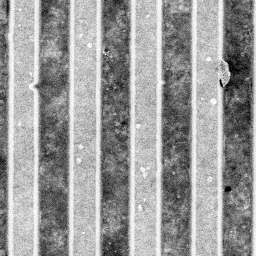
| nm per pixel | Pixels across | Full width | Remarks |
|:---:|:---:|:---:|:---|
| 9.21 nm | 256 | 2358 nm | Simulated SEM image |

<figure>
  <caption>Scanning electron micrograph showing one or a few lines or trenches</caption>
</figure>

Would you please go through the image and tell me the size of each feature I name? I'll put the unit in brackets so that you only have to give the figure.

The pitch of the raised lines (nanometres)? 564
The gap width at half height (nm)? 318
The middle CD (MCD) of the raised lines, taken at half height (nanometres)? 246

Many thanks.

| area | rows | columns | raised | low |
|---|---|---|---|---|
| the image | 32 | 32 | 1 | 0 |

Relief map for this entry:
01111000011100000111000011110000
01111000011100000111000011110000
01111000011100000111000011110000
01111000011100000111000011110000
01111000011100000111000011110000
01111000011100000111000011110000
01111000011100000111000011110000
01111000011100000111000011110000
01111000011100000111000011111000
01111000011100000111000011111000
01110000011100000111000011110000
01110000011100000111000011110000
01111000011100000111000011100000
01111000011100000111000011100000
01111000011100000111000011100000
01111000011100000111000011100000
01111000011100000111000011100000
01111000011100000111000011100000
01111000011100000111000011100000
01111000011100000111000011100000
01111000011100000111000011100000
01111000011100000111000011100000
01110000011100000111000011100000
01110000011100000111000011110000
01110000011100000111000011100000
01110000011100000111000011100000
01110000011100000111000011100000
01110000011100001111000011100000
01110000011100000111000011100000
01110000011100000111000011100000
01110000011100000111000011100000
01110000011100000111000011100000